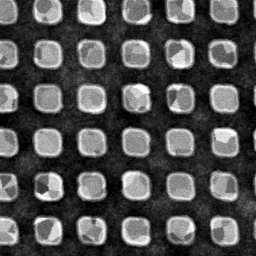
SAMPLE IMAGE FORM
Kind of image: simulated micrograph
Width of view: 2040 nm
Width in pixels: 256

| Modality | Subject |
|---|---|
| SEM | a regular array of raised bodies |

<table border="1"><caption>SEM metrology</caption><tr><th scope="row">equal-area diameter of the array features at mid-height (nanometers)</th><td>233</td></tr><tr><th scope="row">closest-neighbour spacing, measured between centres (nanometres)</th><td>347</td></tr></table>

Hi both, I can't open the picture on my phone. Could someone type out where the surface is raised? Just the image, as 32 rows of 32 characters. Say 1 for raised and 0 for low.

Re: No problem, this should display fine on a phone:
11001111001110011110011100111100
11001111001110011110011100111100
11000110001110001100011100011000
00000000000000000000000000000000
00000000000000000000000000000000
11000110001110001100011100111000
11001111001110011110011100111100
11001111001110011110011100111100
00000000000000000000000000000000
00000000000000000000000000000000
00000000000000000000000000000000
11001111001110011110011100111100
11001111001110011110011100111100
11000111001110001110011100011100
00000000000000000000000000000000
00000000000000000000000000000000
11000110001110001100011100011000
11001111001110011110011100111100
11001111001110011110011100011100
00000010000000000000001100001000
00000000000000000000000000000000
00000000000000000000000000000000
11001111001110011110011100111100
11001111001110011110011100111100
11000111001110001110011100011100
00000000000000000000000000000000
00000000000000000000000000000000
11000110001110001100011100011000
11001111001110011110011100111100
11001111001110011110011100111100
11000010000110000100001100001000
00000000000000000000000000000000